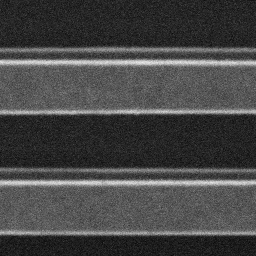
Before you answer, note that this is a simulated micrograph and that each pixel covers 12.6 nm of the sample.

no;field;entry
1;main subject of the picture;lines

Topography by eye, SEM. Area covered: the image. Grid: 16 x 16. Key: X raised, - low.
----------------
----------------
----------------
----------------
XXXXXXXXXXXXXXXX
XXXXXXXXXXXXXXXX
XXXXXXXXXXXXXXXX
----------------
----------------
----------------
----------------
XXXXXXXXXXXXXXXX
XXXXXXXXXXXXXXXX
XXXXXXXXXXXXXXXX
XXXXXXXXXXXXXXXX
----------------